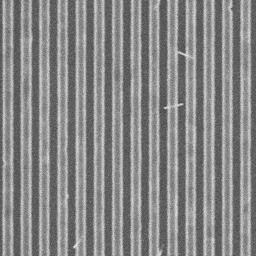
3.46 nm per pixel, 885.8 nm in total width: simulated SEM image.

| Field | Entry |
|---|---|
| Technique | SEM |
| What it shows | parallel lines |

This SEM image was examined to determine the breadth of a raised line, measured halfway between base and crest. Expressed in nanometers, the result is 28.5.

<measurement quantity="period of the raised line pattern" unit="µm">0.0633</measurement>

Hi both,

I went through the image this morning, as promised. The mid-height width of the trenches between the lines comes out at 0.0346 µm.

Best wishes